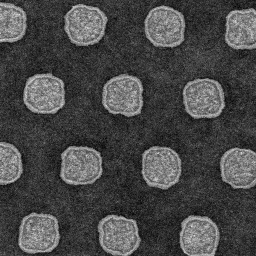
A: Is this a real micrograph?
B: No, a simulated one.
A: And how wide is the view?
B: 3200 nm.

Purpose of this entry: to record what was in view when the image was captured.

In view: a regular array of raised bodies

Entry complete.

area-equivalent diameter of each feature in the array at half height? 500 nanometers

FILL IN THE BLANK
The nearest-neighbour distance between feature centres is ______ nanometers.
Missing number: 999